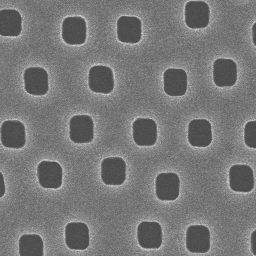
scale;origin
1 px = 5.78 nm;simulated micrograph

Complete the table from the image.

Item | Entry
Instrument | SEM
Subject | a regular array of holes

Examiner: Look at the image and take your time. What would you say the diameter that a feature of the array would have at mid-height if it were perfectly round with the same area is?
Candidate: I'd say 156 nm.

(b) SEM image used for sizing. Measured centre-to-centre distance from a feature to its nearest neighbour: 313 nm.